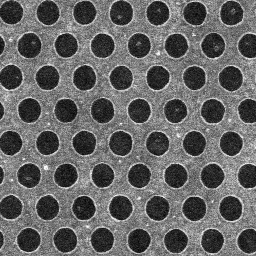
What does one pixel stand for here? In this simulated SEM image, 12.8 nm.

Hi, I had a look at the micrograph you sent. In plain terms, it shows a regular array of holes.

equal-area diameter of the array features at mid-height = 312 nanometers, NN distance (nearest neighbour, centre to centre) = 0.467 micrometres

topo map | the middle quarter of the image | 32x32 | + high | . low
++++...++++++..+++++++..++++++++
+++.....++++.....++++.....++++..
++......+++......++++.....++++..
++......+++......++++.....++++..
++......+++......++++.....++++..
+++.....++++.....++++....+++++..
++++...++++++..+++++++..++++++++
++++++++++++++++++++++++++++++++
+++++++++.++++++++++++++++++++++
...++++.....+++++....+++++....++
...++++.....++++......+++......+
...++++......+++......+++......+
...++++......+++......+++......+
...++++.....++++.....++++.....++
..++++++...+++++++..++++++...+++
++++++++++++++++++++++++++++++++
++++++++++++++++++++++++++++++++
+++....+++++....+++++....++++++.
++......+++......++++.....++++..
++......+++......+++......++++..
++......+++......+++......++++..
+++.....++++.....++++.....++++..
++++...++++++...++++++...++++++.
++++++++++++++++++++++++++++++++
++++++++++++++++++++++++++++++++
...+++++...++++++....+++++....++
...++++.....++++.....++++......+
....+++......+++......+++......+
....+++......+++......+++......+
...++++.....++++.....++++......+
..++++++...++++++...++++++....++
++++++++++++++++++++++++++++++++